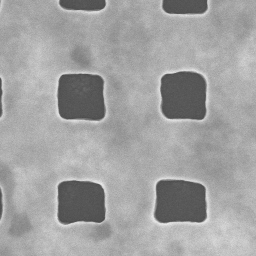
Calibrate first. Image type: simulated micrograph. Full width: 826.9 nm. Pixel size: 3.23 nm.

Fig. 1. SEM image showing holes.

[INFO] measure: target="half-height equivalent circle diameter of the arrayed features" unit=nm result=162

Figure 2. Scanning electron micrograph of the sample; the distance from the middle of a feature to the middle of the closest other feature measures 0.327 microns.